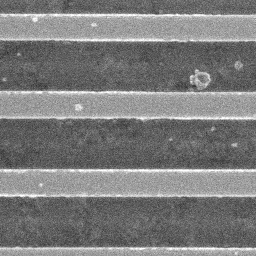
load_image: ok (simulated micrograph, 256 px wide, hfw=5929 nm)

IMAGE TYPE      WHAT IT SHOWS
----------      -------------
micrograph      lines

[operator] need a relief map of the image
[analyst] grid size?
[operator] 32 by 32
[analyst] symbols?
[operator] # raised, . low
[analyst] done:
................................
................................
################################
################################
################################
................................
................................
................................
................................
................................
................................
................................
################################
################################
################################
................................
................................
................................
................................
................................
................................
################################
################################
################################
................................
................................
................................
................................
................................
................................
................................
################################